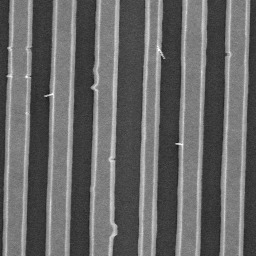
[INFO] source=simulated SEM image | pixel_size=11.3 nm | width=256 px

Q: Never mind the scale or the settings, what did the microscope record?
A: parallel lines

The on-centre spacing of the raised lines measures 43.4 pixels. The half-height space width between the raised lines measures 0.275 um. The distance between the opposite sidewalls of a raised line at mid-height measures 218 nm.